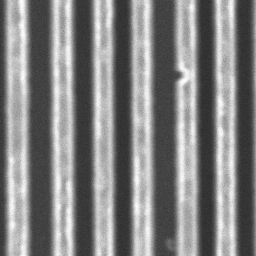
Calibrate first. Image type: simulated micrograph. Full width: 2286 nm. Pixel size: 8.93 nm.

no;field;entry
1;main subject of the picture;parallel lines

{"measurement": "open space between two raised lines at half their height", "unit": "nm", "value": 186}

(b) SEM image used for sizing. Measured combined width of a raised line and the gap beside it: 372 nm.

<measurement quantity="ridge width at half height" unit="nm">171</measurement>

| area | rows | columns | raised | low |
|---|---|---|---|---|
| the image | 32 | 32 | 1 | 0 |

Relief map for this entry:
01100001100011000110001100011000
01100001100011000110001100011000
01100001100011000110001100011000
01100001100011000110001100011000
01100001100011000110001100011000
01100001100011000110001100011000
01100001100011000110001100011000
01100001100011000110001100011000
01100001100011000110001100011000
01100001100011000110000100011000
01100001100011000110001100011000
01100001100011000110001100011000
01100001100011000110001100011000
01100001100011000110001110011000
01100001100011000110001110011000
01100001100011000110001110011000
01100001100011000110001110011000
01100001100011000110001110011000
01100001100011000110001110011000
01100001100011000110001110011000
01100001100011000110001110011000
01100001100011000110001110011000
01100001100011000110001110011000
01100001100011000110001110011000
01100001100011000110001110011000
01100001100011000110001110011000
01100001100011000110001110011000
01100001100011000110001110011000
01100001100011000110001110011000
01100001100011000110001110011000
01100001100011000110001110011000
01100001100011000110001110011000